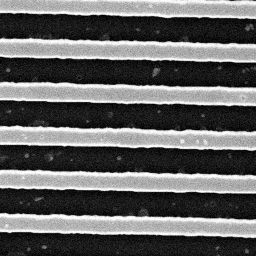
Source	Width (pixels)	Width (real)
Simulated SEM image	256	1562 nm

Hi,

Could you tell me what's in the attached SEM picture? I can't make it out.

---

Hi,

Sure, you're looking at lines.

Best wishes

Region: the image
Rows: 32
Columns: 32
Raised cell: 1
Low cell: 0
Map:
11111111111111111111111111111111
11111111111111111111111111111111
00000000000000000000000000000000
00000000000000000000000000000000
00000000000000000000000000000000
11111111111111111111111110000000
11111111111111111111111111111111
00000000000000000001011111111111
00000000000000000000000000000000
00000000000000000000000000000000
11111111100000000000000000000000
11111111111111111111111111111111
00111111111111111111111111111111
00000000000000000000000000000000
00000000000000000000000000000000
00000000000000000000000000000000
11111111111111111111111111101000
11111111111111111111111111111111
00000000000000000000001111111111
00000000000000000000000000000000
00000000000000000000000000000000
11111100000000000000000000000000
11111111111111111111111111111111
00011111111111111111111111111111
00000000000000000000000000000000
00000000000000000000000000000000
00000000000000000000000000000000
11111111111111111111111111111100
11111111111111111111111111111111
00000000000000000000000000000111
00000000000000000000000000000000
00000000000000000000000000000000